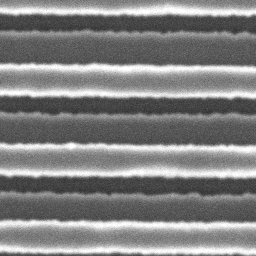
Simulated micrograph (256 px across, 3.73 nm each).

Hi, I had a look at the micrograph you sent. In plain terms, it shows lines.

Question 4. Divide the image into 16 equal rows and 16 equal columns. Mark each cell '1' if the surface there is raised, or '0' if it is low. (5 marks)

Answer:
1111111111111111
0000000000000000
0000000000000000
0000000000000000
1111111111111111
1111111111111111
0000000000000000
0000000000000000
0000000000000000
1111111111111111
1111111111111111
0000000000000000
0000000000000000
0000000000000000
1111111111111111
1111111111111111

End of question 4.